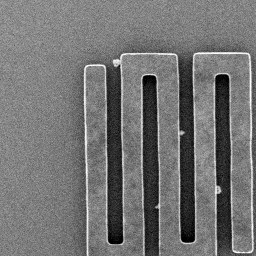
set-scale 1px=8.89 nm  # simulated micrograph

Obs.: groups of lines, slits or small figures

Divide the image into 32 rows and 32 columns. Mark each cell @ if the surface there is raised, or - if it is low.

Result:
--------------------------------
--------------------------------
--------------------------------
--------------------------------
--------------------------------
--------------------------------
--------------------------------
---------------@@@@@@@--@@@@@@@-
-----------@@--@@@@@@@--@@@@@@@-
-----------@@--@@@-@@@--@@@-@@@-
-----------@@--@@@--@@--@@@--@@-
-----------@@--@@@--@@--@@@--@@-
-----------@@--@@@--@@--@@@--@@-
-----------@@--@@@--@@--@@@--@@-
-----------@@--@@@--@@--@@@--@@-
-----------@@--@@@--@@--@@@--@@-
-----------@@--@@@--@@--@@@--@@-
-----------@@--@@@--@@--@@@--@@-
-----------@@--@@@--@@--@@@--@@-
-----------@@--@@@--@@--@@@--@@-
-----------@@--@@@--@@--@@@--@@-
-----------@@--@@@--@@--@@@--@@-
-----------@@--@@@--@@--@@@--@@-
-----------@@--@@@--@@--@@@--@@-
-----------@@--@@@--@@--@@@--@@-
-----------@@--@@@--@@--@@@--@@-
-----------@@--@@@--@@---@@--@@@
-----------@@--@@@--@@---@@--@@@
-----------@@--@@@--@@---@@--@@@
-----------@@--@@@--@@@-@@@--@@@
-----------@@@-@@@--@@@@@@@--@@@
-----------@@@@@@@--@@@@@@@---@-